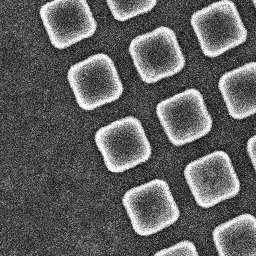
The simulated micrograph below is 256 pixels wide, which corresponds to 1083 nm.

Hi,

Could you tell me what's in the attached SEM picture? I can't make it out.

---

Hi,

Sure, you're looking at raised bodies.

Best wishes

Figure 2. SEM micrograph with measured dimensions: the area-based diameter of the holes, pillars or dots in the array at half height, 208 nm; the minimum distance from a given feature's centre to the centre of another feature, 0.284 um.